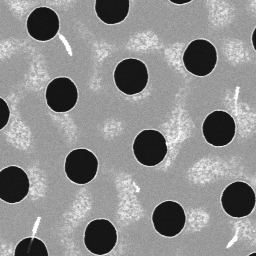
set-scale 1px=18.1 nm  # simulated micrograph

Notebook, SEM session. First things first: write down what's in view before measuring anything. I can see a regular array of holes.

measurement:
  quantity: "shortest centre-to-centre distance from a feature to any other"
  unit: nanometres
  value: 1290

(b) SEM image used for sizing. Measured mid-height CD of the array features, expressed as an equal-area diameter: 0.621 um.